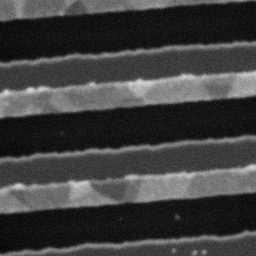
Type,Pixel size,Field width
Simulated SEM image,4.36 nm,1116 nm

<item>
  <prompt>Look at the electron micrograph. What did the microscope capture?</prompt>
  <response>lines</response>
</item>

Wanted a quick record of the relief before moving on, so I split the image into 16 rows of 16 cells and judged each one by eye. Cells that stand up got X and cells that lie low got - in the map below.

XXXXXXXXXX------
----------------
----------------
----XXXXXXXXXXXX
XXXXXXXXXXXXXXXX
XXXXXXXXXXXXXXXX
XXXXXXXXX-------
----------------
----------------
-----XXXXXXXXXXX
XXXXXXXXXXXXXXXX
XXXXXXXXXXXXXXXX
XXXXXXXXXX------
----------------
----------------
-----XXXXXXXXXXX